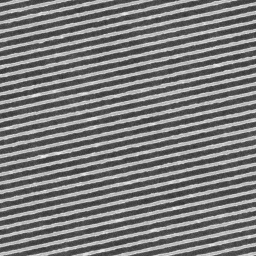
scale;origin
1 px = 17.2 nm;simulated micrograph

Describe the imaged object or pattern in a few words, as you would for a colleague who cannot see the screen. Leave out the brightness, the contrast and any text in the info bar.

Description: parallel lines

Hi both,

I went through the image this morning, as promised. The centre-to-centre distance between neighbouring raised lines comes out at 150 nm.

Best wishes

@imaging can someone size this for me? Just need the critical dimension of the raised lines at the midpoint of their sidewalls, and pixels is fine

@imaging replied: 2.81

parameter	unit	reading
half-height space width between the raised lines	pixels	5.74